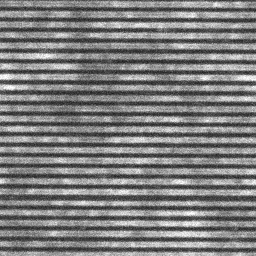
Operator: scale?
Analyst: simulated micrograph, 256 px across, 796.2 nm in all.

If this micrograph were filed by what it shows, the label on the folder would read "parallel lines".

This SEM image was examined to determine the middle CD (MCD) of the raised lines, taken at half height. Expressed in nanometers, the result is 13.2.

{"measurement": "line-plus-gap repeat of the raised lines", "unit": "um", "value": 0.0324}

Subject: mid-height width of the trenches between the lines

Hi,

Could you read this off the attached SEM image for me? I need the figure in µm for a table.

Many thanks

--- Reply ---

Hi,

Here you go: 0.0186